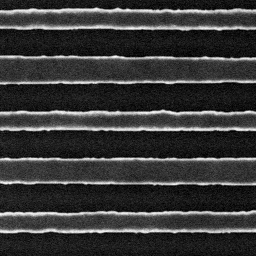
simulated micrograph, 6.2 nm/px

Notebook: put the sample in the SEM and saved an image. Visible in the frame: lines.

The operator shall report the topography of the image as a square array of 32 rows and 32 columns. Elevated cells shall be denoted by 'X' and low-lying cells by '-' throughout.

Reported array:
--------------------------------
XXXXXXXXXXXXXXXXXXXXXXXXXXXXXXXX
XXXXXXXXXXXXXXXXXXXXXXXXXXXXXXXX
XXXXXXXXXXXXXXXXXXXXXXXXXXXXXXXX
--------------------------------
--------------------------------
--------------------------------
XXXXXXXXXXXXXXXXXXXXXXXXXXXXXXXX
XXXXXXXXXXXXXXXXXXXXXXXXXXXXXXXX
XXXXXXXXXXXXXXXXXXXXXXXXXXXXXXXX
X-------------------------------
--------------------------------
--------------------------------
--------------------------------
XXXXXXXXXXXXXXXXXXXXXXXXXXXXXXXX
XXXXXXXXXXXXXXXXXXXXXXXXXXXXXXXX
--------------------------------
--------------------------------
--------------------------------
--------------------------------
XXXXXXXXXXXXXXXXXXXXXXXXXXXXXXXX
XXXXXXXXXXXXXXXXXXXXXXXXXXXXXXXX
XXXXXXXXXXXXXXXXXXXXXXXXXXXXXXXX
--------------------------------
--------------------------------
--------------------------------
------------XXX-----XXXXXXX---XX
XXXXXXXXXXXXXXXXXXXXXXXXXXXXXXXX
XXXXXXXXXXXXXXXXXXXXXXXXXXXXXXXX
--------------------------------
--------------------------------
--------------------------------